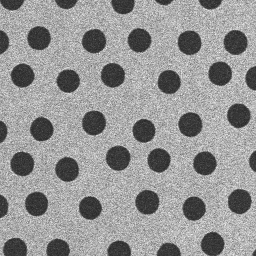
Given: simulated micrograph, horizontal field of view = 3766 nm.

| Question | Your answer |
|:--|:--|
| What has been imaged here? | a regular array of holes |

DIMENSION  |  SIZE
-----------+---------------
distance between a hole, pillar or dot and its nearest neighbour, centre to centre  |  41.2 pixels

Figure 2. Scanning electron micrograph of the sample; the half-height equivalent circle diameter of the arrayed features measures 0.354 microns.